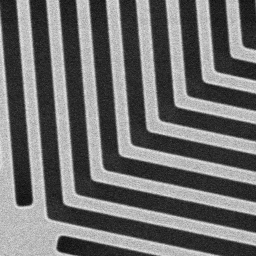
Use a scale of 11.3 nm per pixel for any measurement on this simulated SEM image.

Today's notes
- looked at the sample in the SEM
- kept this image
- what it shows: groups of lines, slits or small figures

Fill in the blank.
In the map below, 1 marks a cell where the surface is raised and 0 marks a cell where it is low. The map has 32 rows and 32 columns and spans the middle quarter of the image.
00000110000011100001111000011100
00000110000011100000111000011100
00000111000011100000111000011100
00000111000011100000111000011100
00000111000011100000111000011100
00000111000011100000111000011100
00000111000011100000111000011110
00000111000001100000111000011110
10000111000001100000111000001111
10000111000001110000111000001111
10000111000001110000111000001111
10000111000001110000111000000001
10000011000001110000111000000000
10000011000001110000011100000000
10000011100001110000011110000000
10000011100001110000011111111000
10000011100001110000011111111111
10000011100001110000000011111111
10000011100000110000000000001111
11000011100000111000000000000000
11000011100000111100000000000000
11000011100000111111110000000000
11000011100000111111111111100000
11000011100000001111111111111110
11000001100000000000011111111111
11000001110000000000000000111111
11000001110000000000000000000011
11000001111111000000000000000000
11000001111111111110000000000000
11000000011111111111111100000000
11000000000000111111111111111000
11100000000000000011111111111111